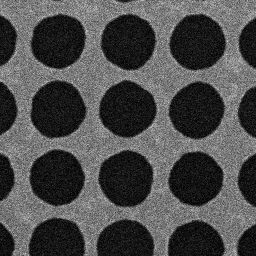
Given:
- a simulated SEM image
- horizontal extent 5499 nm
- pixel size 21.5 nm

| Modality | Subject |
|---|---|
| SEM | a regular array of holes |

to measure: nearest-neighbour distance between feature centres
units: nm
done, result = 1460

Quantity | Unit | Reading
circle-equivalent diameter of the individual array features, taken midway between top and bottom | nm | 1210